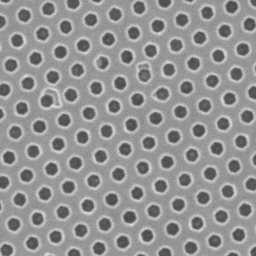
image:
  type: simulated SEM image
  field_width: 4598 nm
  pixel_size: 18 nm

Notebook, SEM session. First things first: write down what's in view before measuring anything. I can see a regular array of holes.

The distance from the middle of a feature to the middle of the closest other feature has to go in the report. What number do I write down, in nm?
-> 446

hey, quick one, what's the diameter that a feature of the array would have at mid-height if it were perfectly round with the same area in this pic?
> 240 nm